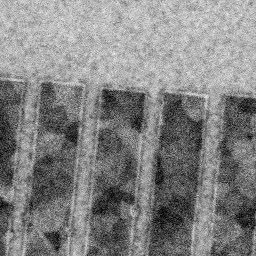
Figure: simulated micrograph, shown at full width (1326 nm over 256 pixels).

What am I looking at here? one or a few lines or trenches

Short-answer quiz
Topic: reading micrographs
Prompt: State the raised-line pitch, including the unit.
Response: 0.318 um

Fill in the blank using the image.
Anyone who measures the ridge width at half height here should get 232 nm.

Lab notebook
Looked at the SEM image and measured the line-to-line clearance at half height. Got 89 nm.